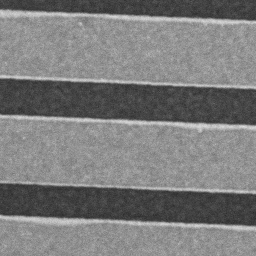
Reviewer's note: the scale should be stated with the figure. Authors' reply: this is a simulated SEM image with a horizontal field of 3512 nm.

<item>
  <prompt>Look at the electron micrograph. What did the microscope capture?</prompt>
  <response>lines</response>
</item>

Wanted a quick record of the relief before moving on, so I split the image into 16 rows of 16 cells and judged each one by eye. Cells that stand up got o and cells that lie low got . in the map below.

................
oooooooooooooooo
oooooooooooooooo
oooooooooooooooo
oooooooooooooooo
...............o
................
oooooo..........
oooooooooooooooo
oooooooooooooooo
oooooooooooooooo
..oooooooooooooo
................
................
oooooooooooooooo
oooooooooooooooo